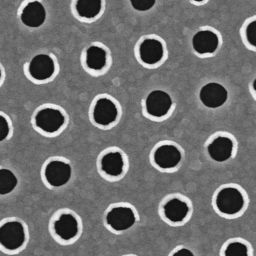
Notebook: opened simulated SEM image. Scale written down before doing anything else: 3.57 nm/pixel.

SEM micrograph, a regular array of holes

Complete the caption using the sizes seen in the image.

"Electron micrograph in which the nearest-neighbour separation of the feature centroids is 191 nm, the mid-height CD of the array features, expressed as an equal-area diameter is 88.7 nm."